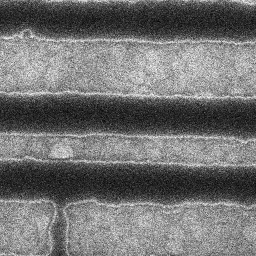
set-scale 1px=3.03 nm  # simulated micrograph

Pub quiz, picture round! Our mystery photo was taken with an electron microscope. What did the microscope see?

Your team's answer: one or a few lines or trenches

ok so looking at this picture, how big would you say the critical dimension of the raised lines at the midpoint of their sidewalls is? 128 nm